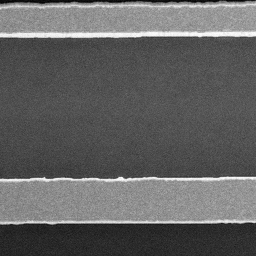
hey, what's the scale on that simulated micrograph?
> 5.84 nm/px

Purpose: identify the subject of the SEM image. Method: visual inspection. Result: lines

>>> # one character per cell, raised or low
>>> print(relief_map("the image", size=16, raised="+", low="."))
++++++++++++++++
++++++++++++++++
................
................
................
................
................
................
................
................
................
++++++++++++++++
++++++++++++++++
++++++++++++++++
................
................